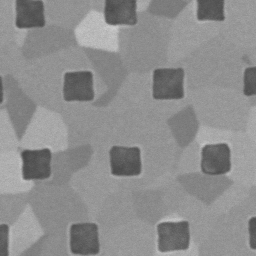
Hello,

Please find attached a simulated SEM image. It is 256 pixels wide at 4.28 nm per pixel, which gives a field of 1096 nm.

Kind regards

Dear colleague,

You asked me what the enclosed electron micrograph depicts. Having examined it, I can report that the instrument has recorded holes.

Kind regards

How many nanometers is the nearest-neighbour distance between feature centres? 378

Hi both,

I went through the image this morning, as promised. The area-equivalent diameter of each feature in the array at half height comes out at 147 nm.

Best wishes